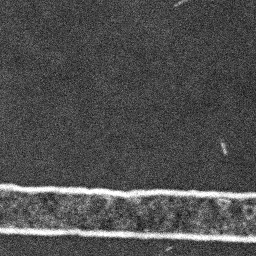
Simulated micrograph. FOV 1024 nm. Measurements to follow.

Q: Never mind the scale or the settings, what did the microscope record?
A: one or a few lines or trenches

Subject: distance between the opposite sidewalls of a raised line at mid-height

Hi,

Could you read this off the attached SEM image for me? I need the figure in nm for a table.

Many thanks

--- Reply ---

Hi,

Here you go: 174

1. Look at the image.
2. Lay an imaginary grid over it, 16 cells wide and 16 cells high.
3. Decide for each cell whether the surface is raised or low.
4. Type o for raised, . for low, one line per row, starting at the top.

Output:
................
................
................
................
................
................
................
................
................
................
................
................
oooooooooooooooo
oooooooooooooooo
..oo.ooooooooooo
................